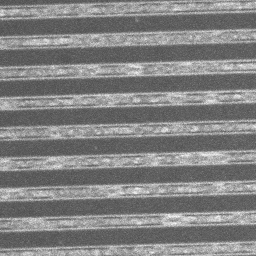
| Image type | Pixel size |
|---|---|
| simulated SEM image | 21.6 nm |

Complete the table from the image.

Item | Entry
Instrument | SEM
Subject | parallel lines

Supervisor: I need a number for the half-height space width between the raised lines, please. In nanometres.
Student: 232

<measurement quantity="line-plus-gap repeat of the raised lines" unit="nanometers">656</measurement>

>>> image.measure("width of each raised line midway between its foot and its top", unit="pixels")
19.6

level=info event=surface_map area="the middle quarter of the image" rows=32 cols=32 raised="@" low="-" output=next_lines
--------------------------------
--------------------------------
----------------------------@@@@
@@@@@@@@@@@@@@@@@@@@@@@@@@@@@@@@
@@@@@@@@@@@@@@@@@@@@@@@@@@@@@@@@
@@@@@@@@@@@@@@@@@@@@@@@@@@@@@@@@
@@@@@@@@@@@@@@@@@@@@@@@@@@@@@@@@
@@@@@@@@@@@@@@@@@---------------
--------------------------------
--------------------------------
--------------@@@@@@@@@@@@@@@@@@
@@@@@@@@@@@@@@@@@@@@@@@@@@@@@@@@
@@@@@@@@@@@@@@@@@@@@@@@@@@@@@@@@
@@@@@@@@@@@@@@@@@@@@@@@@@@@@@@@@
@@@@@@@@@@@@@@@@@@@@@@@@@@@@@@@@
@@@@----------------------------
--------------------------------
--------------------------------
@@@@@@@@@@@@@@@@@@@@@@@@@@@@@@@@
@@@@@@@@@@@@@@@@@@@@@@@@@@@@@@@@
@@@@@@@@@@@@@@@@@@@@@@@@@@@@@@@@
@@@@@@@@@@@@@@@@@@@@@@@@@@@@@@@@
@@@@@@@@@@@@@@@@@@@@@@@---------
--------------------------------
--------------------------------
--------------------@@@@@@@@@@@@
@@@@@@@@@@@@@@@@@@@@@@@@@@@@@@@@
@@@@@@@@@@@@@@@@@@@@@@@@@@@@@@@@
@@@@@@@@@@@@@@@@@@@@@@@@@@@@@@@@
@@@@@@@@@@@@@@@@@@@@@@@@@@@@@@@@
@@@@@@@@@-----------------------
--------------------------------